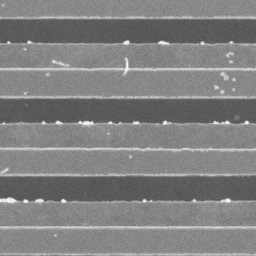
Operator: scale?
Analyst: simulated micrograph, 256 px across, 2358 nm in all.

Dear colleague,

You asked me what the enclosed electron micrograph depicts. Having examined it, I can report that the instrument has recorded lines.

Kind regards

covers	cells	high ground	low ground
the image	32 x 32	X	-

XXXXXXXXXXXXXXXXXXXXXXXXXXXXXXXX
XXXXXXXXXXXXXXXXXXXXXXXXXXXXXXXX
--------------------------------
--------------------------------
--------------------------------
XXXXXXXXXXXXXXXXXXXXXXXXXX-XXXXX
XXXXXXXXXXXXXXXXXXXXXXXXXXXXXXXX
XXXXXXXXXXXXXXXXXXXXXXXXXXXXXXXX
XXXXXXXXXXXXXXXXXXXXXXXXXXXXXXXX
XXXXXXXXXXXXXXXXXXXXXXXXXXXXXXXX
XXXXXXXXXXXXXXXXXXXXXXXXXXXXXXXX
XXXXXXXXXXXXXXXXXXXXXXXXXXXXXXXX
--------------------------------
--------------------------------
--------------------------------
XXXXXXXXXXXXXXXXXXXXXXXXXXXXX-XX
XXXXXXXXXXXXXXXXXXXXXXXXXXXXXXXX
XXXXXXXXXXXXXXXXXXXXXXXXXXXXXXXX
XXXXXXXXXXXXXXXXXXXXXXXXXXXXXXXX
XXXXXXXXXXXXXXXXXXXXXXXXXXXXXXXX
XXXXXXXXXXXXXXXXXXXXXXXXXXXXXXXX
XXXXXXXXXXXXXXXXXXXXXXXXXXXXXXXX
--------------------------------
--------------------------------
--------------------------------
XXXXXXXXXXXXXXXXXXXXXXXXXXXXXXXX
XXXXXXXXXXXXXXXXXXXXXXXXXXXXXXXX
XXXXXXXXXXXXXXXXXXXXXXXXXXXXXXXX
XXXXXXXXXXXXXXXXXXXXXXXXXXXXXXXX
XXXXXXXXXXXXXXXXXXXXXXXXXXXXXXXX
XXXXXXXXXXXXXXXXXXXXXXXXXXXXXXXX
XXXXXXXXXXXXXXXXXXXXXXXXXXXXXXXX